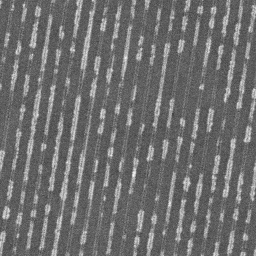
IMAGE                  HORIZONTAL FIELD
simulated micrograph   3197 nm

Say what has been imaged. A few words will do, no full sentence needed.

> parallel lines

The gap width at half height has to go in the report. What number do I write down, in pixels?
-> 10.6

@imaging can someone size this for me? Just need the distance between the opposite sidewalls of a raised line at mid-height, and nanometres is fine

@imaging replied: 33.9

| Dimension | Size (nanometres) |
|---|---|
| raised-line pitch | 166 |